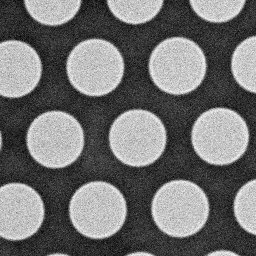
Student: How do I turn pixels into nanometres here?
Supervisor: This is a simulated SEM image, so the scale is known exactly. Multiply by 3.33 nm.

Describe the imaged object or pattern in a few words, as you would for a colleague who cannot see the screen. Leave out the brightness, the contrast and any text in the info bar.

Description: an array of small figures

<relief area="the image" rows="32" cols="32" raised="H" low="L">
LLLHHHHHHHLLLLHHHHHHLLLLHHHHHHLL
LLLLHHHHHHLLLLHHHHHHLLLLLHHHHHLL
LLLLLHHHHLLLLLLHHHHLLLLLLLHHLLLL
LLLLLLLLLLLLLLLLLLLLLLLLLLLLLLLL
LLLLLLLLLLLLLLLLLLLLLLLLLLLLLLLL
HHHLLLLLLLHHHHLLLLLLHHHHLLLLLLHH
HHHHLLLLLHHHHHHLLLLHHHHHHLLLLHHH
HHHHHLLLLHHHHHHLLLLHHHHHHHLLLHHH
HHHHHLLLHHHHHHHLLLLHHHHHHHLLLHHH
HHHHHLLLLHHHHHHLLLLHHHHHHLLLLHHH
HHHHHLLLLHHHHHHLLLLLHHHHHLLLLLHH
HHHHLLLLLLHHHHLLLLLLLHHLLLLLLLLL
LLLLLLLLLLLLLLLLLLLLLLLLLLLLLLLL
LLLLLLLLLLLLLLLLLLLLLLLLLLLLLLLL
LLLLLHHHHLLLLLLHHHHLLLLLLHHHHHLL
LLLLHHHHHHLLLLHHHHHHLLLLHHHHHHHL
LLLLHHHHHHLLLLHHHHHHHLLLHHHHHHHL
LLLHHHHHHHLLLLHHHHHHHLLLHHHHHHHL
LLLLHHHHHHLLLLHHHHHHLLLLHHHHHHHL
LLLLHHHHHHLLLLLHHHHHLLLLLHHHHHLL
LLLLLHHHHLLLLLLLHHHLLLLLLLLHLLLL
LLLLLLLLLLLLLLLLLLLLLLLLLLLLLLLL
LLLLLLLLLLLLLLLLLLLLLLLLLLLLLLLL
HHHHLLLLLLHHHHLLLLLLHHHHHLLLLLHH
HHHHHLLLLHHHHHHLLLLHHHHHHHLLLLHH
HHHHHLLLLHHHHHHHLLLHHHHHHHLLLHHH
HHHHHLLLLHHHHHHHLLLHHHHHHHLLLHHH
HHHHHLLLLHHHHHHHLLLHHHHHHHLLLLHH
HHHHHLLLLLHHHHHLLLLLHHHHHLLLLLLH
HHHHLLLLLLLHHLLLLLLLLLHLLLLLLLLL
LLLLLLLLLLLLLLLLLLLLLLLLLLLLLLLL
LLLLLLLLLLLLLLLLLLLLLLLLLLLHHLLL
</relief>